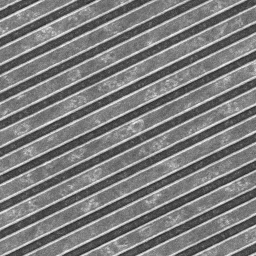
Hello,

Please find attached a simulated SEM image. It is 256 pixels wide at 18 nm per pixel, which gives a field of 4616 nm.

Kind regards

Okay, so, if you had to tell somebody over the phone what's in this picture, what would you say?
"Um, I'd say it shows parallel lines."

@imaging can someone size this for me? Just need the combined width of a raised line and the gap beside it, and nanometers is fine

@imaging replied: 445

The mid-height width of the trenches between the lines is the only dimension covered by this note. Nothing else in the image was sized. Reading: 174 nm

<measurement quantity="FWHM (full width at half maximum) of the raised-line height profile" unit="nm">269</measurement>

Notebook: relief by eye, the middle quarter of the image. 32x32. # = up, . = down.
...#########.....#########.....#
.#########.....#########.....###
########.....#########.....#####
#####......#########.....#######
###......########......########.
#......########......########...
.....########......########.....
...########......########......#
.########......########......###
#######......########.....######
#####......########.....########
###......########.....#########.
#......########.....#########...
.....########.....#########.....
...########.....#########......#
#########.....#########......###
#######.....#########......#####
#####.....#########......#######
###.....#########.....#########.
#.....#########.....########....
....#########......########.....
..#########.....#########.....##
#########.....#########.....####
#######.....#########.....######
#####.....#########.....########
###.....#########.....#########.
#.....#########.....#########...
....########......########......
..########......########......##
########......########......####
######......########......######
####......########......########